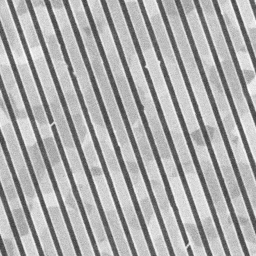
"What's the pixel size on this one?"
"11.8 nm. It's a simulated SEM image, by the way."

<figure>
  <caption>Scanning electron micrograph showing parallel lines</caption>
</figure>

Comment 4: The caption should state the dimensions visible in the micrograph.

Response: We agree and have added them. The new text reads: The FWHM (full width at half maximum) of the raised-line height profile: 135 nanometres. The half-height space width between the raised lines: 75.3 nanometers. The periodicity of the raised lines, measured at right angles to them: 208 nm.